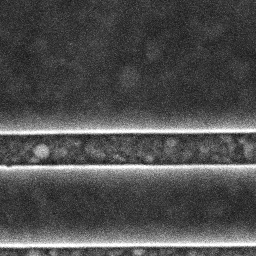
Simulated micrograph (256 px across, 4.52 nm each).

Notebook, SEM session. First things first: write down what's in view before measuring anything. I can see one or a few lines or trenches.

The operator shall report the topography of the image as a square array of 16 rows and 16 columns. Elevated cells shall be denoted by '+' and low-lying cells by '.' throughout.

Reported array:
++++++++++++++++
++++++++++++++++
++++++++++++++++
++++++++++++++++
++++++++++++++++
++++++++++++++++
++++++++++++++++
++++++++++++++++
................
................
++++++++++++++++
++++++++++++++++
++++++++++++++++
++++++++++++++++
++++++++++++++++
................